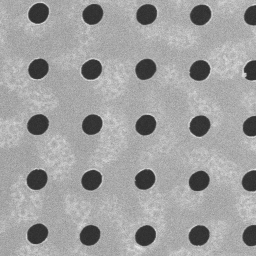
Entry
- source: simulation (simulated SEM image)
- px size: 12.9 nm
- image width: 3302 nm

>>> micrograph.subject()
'a regular array of holes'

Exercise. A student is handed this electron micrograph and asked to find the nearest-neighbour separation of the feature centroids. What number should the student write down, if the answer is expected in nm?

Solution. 691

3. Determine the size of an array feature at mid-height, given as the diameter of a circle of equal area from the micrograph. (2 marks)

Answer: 269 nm